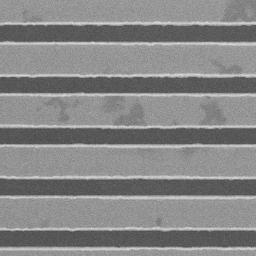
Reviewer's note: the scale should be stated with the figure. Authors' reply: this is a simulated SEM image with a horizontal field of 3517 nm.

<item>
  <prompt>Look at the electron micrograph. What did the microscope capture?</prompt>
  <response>lines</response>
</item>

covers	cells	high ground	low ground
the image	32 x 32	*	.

********************************
********************************
********************************
................................
................................
********************************
********************************
********************************
********************************
******..************************
................................
................................
********************************
********************************
********************************
********************************
................................
................................
********************************
********************************
********************************
********************************
................................
................................
................................
********************************
********************************
********************************
********************************
................................
................................
********************************